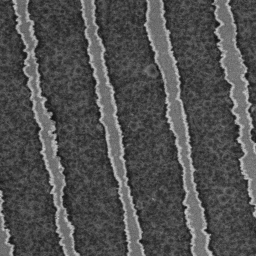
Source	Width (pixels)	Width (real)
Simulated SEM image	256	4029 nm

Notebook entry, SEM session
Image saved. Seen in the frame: one or a few lines or trenches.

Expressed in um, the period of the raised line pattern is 1.03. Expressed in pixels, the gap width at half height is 52.2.